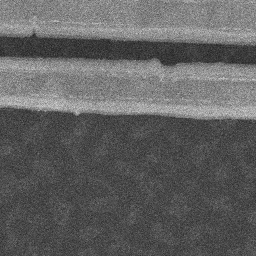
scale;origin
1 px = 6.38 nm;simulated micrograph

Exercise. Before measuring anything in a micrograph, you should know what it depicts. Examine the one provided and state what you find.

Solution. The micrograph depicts one or a few lines or trenches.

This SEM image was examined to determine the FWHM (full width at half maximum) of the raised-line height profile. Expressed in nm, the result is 260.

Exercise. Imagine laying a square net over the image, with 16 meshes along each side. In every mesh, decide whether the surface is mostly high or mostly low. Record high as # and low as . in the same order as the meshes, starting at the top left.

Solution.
################
################
................
................
##########.#####
################
...#############
................
................
................
................
................
................
................
................
................